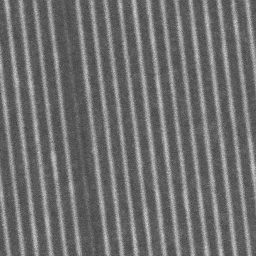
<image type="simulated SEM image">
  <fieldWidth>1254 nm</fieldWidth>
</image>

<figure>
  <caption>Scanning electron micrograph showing parallel lines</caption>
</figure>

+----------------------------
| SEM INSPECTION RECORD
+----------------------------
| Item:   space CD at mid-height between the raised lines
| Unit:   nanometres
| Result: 52.9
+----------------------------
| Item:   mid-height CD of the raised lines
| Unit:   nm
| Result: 13.4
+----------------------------